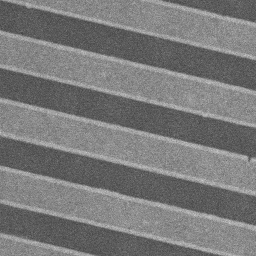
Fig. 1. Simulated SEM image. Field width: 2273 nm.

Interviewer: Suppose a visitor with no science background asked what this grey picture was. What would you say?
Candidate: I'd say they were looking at one or a few lines or trenches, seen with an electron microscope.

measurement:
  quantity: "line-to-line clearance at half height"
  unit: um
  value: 0.298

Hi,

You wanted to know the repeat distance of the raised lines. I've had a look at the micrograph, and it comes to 0.585 microns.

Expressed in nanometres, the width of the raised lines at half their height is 289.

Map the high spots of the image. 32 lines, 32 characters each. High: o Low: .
...oooooooooooooooooo...........
........ooooooooooooooooo.......
............ooooooooooooooooo...
................oooooooooooooooo
oo..................oooooooooooo
oooooo...................ooooooo
ooooooooooo..................ooo
ooooooooooooooo.................
.oooooooooooooooooo.............
......ooooooooooooooooo.........
..........ooooooooooooooooo.....
..............ooooooooooooooooo.
..................oooooooooooooo
oooo...................ooooooooo
oooooooo...................ooooo
ooooooooooooo..................o
ooooooooooooooooo...............
...oooooooooooooooooo...........
........ooooooooooooooooo.......
............oooooooooooooooooo..
................oooooooooooooooo
oo..................oooooooooooo
oooooo...................ooooooo
oooooooooo...................ooo
ooooooooooooooo.................
.oooooooooooooooooo.............
......oooooooooooooooooo........
..........oooooooooooooooooo....
..............oooooooooooooooooo
...................ooooooooooooo
ooooo..................ooooooooo
ooooooooo..................ooooo